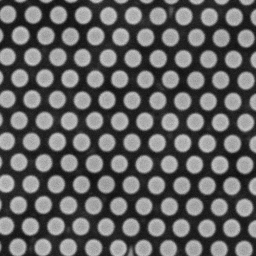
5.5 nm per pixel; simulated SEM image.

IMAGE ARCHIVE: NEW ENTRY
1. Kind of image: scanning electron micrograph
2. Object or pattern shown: a regular array of raised bodies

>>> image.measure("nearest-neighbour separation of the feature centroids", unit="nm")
133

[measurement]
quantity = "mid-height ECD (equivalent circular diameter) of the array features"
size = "93.2 nanometers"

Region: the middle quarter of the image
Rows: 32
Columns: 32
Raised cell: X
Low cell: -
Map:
----X-----XX----XX----XXX----XX-
--------------------------------
XXX---XXX---XXX----XXX---XXX----
XXX---XXXX--XXXX--XXXX---XXXX--X
XXX---XXXX--XXXX--XXXX---XXXX--X
XX-----XX----XX----XX----XXX---X
--------------------------------
---XXX---XXX----XX----XXX----XX-
---XXX---XXXX--XXXX---XXX---XXXX
---XXX---XXXX--XXXX--XXXX---XXXX
---XXX---XXX---XXXX---XXX---XXX-
--------------------------------
XX----XXX----XX----XX-----X-----
XXX---XXXX--XXXX--XXXX---XXX---X
XXX---XXXX--XXXX--XXXX--XXXX---X
XXX---XXX---XXXX--XXXX---XXX---X
-------------XX-----------X-----
--------------------------------
---XXX---XXX---XXXX---XXX---XXX-
--XXXX---XXXX--XXXX--XXXX---XXXX
---XXX---XXXX--XXXX--XXXX---XXXX
---XX-----XX----XX----XXX---XXX-
--------------------------------
XXX---XXX---XXX----XX----XXX---X
XXX---XXXX--XXXX--XXXX--XXXX---X
XXX---XXXX--XXXX--XXXX--XXXX---X
XX----XXX---XXX---XXXX---XXX---X
--------------------------------
---XXX---XXX----XX----XX-----X--
--XXXX---XXX---XXXX--XXXX---XXX-
--XXXX--XXXX---XXXX--XXXX--XXXX-
---XXX---XXX---XXX---XXXX---XXX-